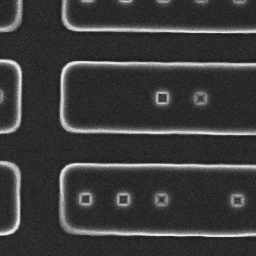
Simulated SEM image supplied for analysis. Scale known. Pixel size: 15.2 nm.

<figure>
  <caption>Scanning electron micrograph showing wiring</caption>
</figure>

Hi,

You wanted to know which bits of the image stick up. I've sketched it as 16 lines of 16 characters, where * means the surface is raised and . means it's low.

*...************
*...************
................
................
*...************
*...************
*...************
*...************
................
................
*...************
*...************
*...************
*...************
*....***********
................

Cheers